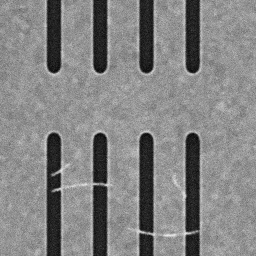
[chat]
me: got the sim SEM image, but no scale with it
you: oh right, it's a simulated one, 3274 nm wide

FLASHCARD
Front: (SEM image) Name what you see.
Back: groups of lines, slits or small figures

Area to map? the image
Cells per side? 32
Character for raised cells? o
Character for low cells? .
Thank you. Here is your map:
oooooo..oooo..ooo..oooo..ooooooo
oooooo..oooo..ooo..oooo..ooooooo
oooooo..oooo..ooo..oooo..ooooooo
oooooo..oooo..ooo..oooo..ooooooo
oooooo..oooo..ooo..oooo..ooooooo
oooooo..oooo..ooo..oooo..ooooooo
oooooo..oooo..ooo..oooo..ooooooo
oooooo..oooo..ooo..oooo..ooooooo
oooooo..oooo.oooo..oooo..ooooooo
oooooooooooooooooooooooooooooooo
oooooooooooooooooooooooooooooooo
oooooooooooooooooooooooooooooooo
oooooooooooooooooooooooooooooooo
oooooooooooooooooooooooooooooooo
oooooooooooooooooooooooooooooooo
oooooooooooooooooooooooooooooooo
oooooooooooooooooooooooooooooooo
oooooo..oooo.oooo..oooo..ooooooo
oooooo..oooo..ooo..oooo..ooooooo
oooooo..oooo..ooo..oooo..ooooooo
oooooo..oooo..ooo..oooo..ooooooo
oooooo..oooo..ooo..oooo..ooooooo
oooooo..oooo..ooo..oooo..ooooooo
oooooo..oooo.oooo..oooo..ooooooo
oooooo..oooo..ooo..oooo..ooooooo
oooooo..oooo..ooo..oooo..ooooooo
oooooo..oooo..ooo..oooo..ooooooo
oooooo..oooo..ooo..oooo..ooooooo
oooooo..oooo..ooo..oooo..ooooooo
oooooo..oooo..ooo..oooo..ooooooo
oooooo..oooo..ooo..oooo..ooooooo
oooooo..oooo..ooo..oooo..ooooooo